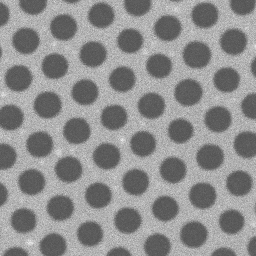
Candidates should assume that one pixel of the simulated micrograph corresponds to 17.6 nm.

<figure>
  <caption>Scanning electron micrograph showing a regular array of holes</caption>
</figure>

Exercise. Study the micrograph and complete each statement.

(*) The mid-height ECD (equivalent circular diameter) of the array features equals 0.48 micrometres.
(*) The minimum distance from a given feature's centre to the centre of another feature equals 680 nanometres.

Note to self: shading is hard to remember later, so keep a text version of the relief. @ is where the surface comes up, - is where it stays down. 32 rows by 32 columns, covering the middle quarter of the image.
-@@@@----@@@@@@@@@@@-------@@@@-
-@@@@@@@@@@@-----@@@@------@@@@@
@@@@@@@@@@@@------@@@------@@@@@
@@@@@@@@@@@-------@@@@@--@@@@@@@
@@@----@@@@-------@@@@@@@@@@@---
@@------@@@@-----@@@@@@@@@@@----
@@-------@@@-----@@@@@@@@@@@----
@@-------@@@@@@@@@@@----@@@-----
@@------@@@@@@@@@@@------@@@----
@@@-----@@@@@@@@@@@------@@@----
@@@@@@@@@@@---@@@@-------@@@@@--
@@@@@@@@@@-----@@@-------@@@@@@@
@@@@@@@@@-------@@@-----@@@@@@@@
@@---@@@@-------@@@@----@@@@@@@@
@-----@@@-------@@@@@@@@@@@----@
-------@@@-----@@@@@@@@@@@------
-------@@@@@-@@@@@@@@@@@@@------
-------@@@@@@@@@@@----@@@@------
------@@@@@@@@@@@------@@@------
@----@@@@@@@@@@@-------@@@@@---@
@@@@@@@@-----@@@-------@@@@@@@@@
@@@@@@@@------@@@------@@@@@@@@@
@@@@@@@-------@@@@----@@@@@@@@@@
---@@@@-------@@@@@@@@@@@@---@@@
----@@@-------@@@@@@@@@@@-----@@
-----@@@-----@@@@@@@@@@@-------@
-----@@@@@@-@@@@---@@@@@-------@
----@@@@@@@@@@@------@@@------@@
----@@@@@@@@@@@------@@@@-----@@
--@@@@@@@@@@@@-------@@@@@---@@@
@@@@@@-----@@@@------@@@@@@@@@@@
@@@@@-------@@@------@@@@@@@@@@@